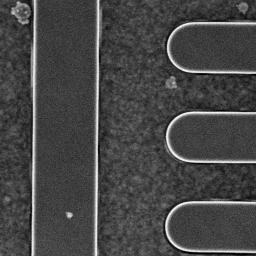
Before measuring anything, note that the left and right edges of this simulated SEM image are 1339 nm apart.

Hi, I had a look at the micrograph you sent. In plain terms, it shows groups of lines, slits or small figures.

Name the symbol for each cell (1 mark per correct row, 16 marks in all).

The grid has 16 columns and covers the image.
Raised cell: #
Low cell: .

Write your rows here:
..####..........
..####......####
..####.....#####
..####.....#####
..####......####
..####..........
..####..........
..####.....#####
..####....######
..####.....#####
..####..........
..####..........
..####..........
..####.....#####
..####....######
..####.....#####